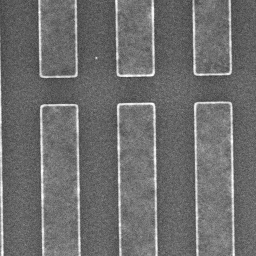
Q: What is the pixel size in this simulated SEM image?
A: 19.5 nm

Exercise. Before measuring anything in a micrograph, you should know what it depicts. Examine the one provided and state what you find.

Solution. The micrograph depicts groups of lines, slits or small figures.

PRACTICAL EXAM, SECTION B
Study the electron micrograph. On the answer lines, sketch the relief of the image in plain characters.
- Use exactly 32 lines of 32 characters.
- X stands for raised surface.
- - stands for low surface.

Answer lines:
-----XXXX------XXXX-----XXXXX---
-----XXXX------XXXX-----XXXXX---
-----XXXX------XXXX-----XXXXX---
-----XXXXX-----XXXX-----XXXXX---
-----XXXXX-----XXXX-----XXXXX---
-----XXXXX-----XXXX-----XXXXX---
-----XXXXX-----XXXX-----XXXXX---
-----XXXXX-----XXXX-----XXXXX---
-----XXXXX-----XXXX-----XXXXX---
-----XXXX------X----------------
--------------------------------
--------------------------------
--------------------------------
-----XXXXX-----XXXX-----XXXXX---
-----XXXXX-----XXXX-----XXXXX---
-----XXXXX-----XXXX-----XXXXX---
-----XXXXX-----XXXX-----XXXXX---
-----XXXXX-----XXXX-----XXXXX---
-----XXXXX-----XXXX-----XXXXX---
-----XXXXX-----XXXX-----XXXXX---
-----XXXXX-----XXXX-----XXXXX---
-----XXXXX-----XXXX-----XXXXX---
-----XXXXX-----XXXX-----XXXXX---
-----XXXXX-----XXXX------XXXX---
-----XXXXX-----XXXX------XXXX---
-----XXXXX-----XXXX------XXXX---
-----XXXXX-----XXXX------XXXX---
-----XXXXX-----XXXX------XXXX---
-----XXXXX-----XXXX------XXXX---
-----XXXXX-----XXXXX-----XXXX---
-----XXXXX-----XXXXX-----XXXX---
-----XXXXX-----XXXXX-----XXXX---